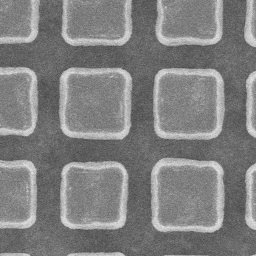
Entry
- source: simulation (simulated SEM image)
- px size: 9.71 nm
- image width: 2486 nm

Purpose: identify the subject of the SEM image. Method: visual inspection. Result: raised bodies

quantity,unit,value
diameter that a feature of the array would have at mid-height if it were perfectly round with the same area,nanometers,707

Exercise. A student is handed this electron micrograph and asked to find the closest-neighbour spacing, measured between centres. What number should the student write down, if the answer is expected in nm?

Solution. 893